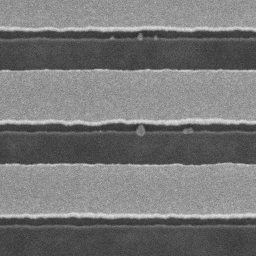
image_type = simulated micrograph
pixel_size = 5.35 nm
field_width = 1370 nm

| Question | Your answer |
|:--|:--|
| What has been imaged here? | lines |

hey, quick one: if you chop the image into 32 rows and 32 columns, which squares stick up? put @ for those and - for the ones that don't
@@@@@@@@@@@@@@@@@@@@@@@@@@@@@@@@
@@@@@@@@@@@@@@@@@@@@@@@@@@@@@@@@
@@@@@@@@@@@@@@@@@@@@@@@@@@@@@@@@
@@@@@@@@@@@@@@@@@@@@@@@@@@@@@@@@
--------------------------------
--------------------------------
--------------------------------
--------------------------------
--------------------------------
@@@@@@@@@@@@@@@@@@@@@@@@@@@@@@@@
@@@@@@@@@@@@@@@@@@@@@@@@@@@@@@@@
@@@@@@@@@@@@@@@@@@@@@@@@@@@@@@@@
@@@@@@@@@@@@@@@@@@@@@@@@@@@@@@@@
@@@@@@@@@@@@@@@@@@@@@@@@@@@@@@@@
@@@@@@@@@@@@@@@@@@@@@@@@@@@@@@@@
--------@--@@-------------------
--------------------------------
--------------------------------
--------------------------------
--------------------------------
----------------------------@---
@@@@@@@@@@@@@@@@@@@@@@@@@@@@@@@@
@@@@@@@@@@@@@@@@@@@@@@@@@@@@@@@@
@@@@@@@@@@@@@@@@@@@@@@@@@@@@@@@@
@@@@@@@@@@@@@@@@@@@@@@@@@@@@@@@@
@@@@@@@@@@@@@@@@@@@@@@@@@@@@@@@@
@@@@@@@@@@@@@@@@@@@@@@@@@@@@@@@@
--------------------------------
--------------------------------
--------------------------------
--------------------------------
--------------------------------